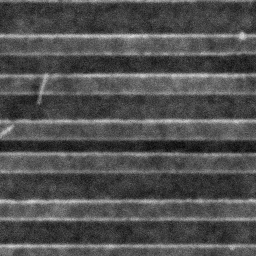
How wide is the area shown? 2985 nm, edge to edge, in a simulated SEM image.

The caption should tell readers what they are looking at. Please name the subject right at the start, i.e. lines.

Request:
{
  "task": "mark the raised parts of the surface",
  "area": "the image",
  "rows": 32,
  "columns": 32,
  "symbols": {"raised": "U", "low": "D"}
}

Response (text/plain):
DDDDDDDDDDDDDDDDDDDDDDDDDDDDDDDD
DDDDDDDDDDDDDDDDDDDDDDDDDDDDDDDD
DDDDDDDDDDDDDDDDDDDDDDDDDDDDDDDD
DDDDDDDDDDDDDDDDDDDDDDDDDDDDDDDD
UUUDUUUUUUUUUUUUUUUUUUUUUUUUUUUU
UUUUUUUUUUUUUUUUUUUUUUUUUUUUUUUU
UUUUUUUUUUUUUUUUUUUUUUUUUUUUUUUU
DDDDDDDDDDDDDDDDDDDDDDDDDDDDDDDD
DDDDDDDDDDDDDDDDDDDDDDDDDDDDDDDD
UUUUUUUUUUUUUUUUUUUUUUUUUUUUUUUU
UUUUUUUUUUUUUUUUUUUUUUUUUUUUUUUU
UUUUUUUUUUUUUUUUUUUUUUUUUUUUUUUU
DDDDDDDDDDDDDDDDDDDDDDDDDDDDDDDD
DDDDDDDDDDDDDDDDDDDDDDDDDDDDDDDD
DDDDDDDDDDDDDDDDDDDDDDDDDDDDDDDD
UUUUUUUUUUUUUUUUUUUUUUUUUUUUUUUU
UUUUUUUUUUUUUUUUUUUUUUUUUUUUUUUU
DDDDDDDDDDDDDDDDDDDDDDDDDDDDDDDD
DDDDDDDDDDDDDDDDDDDDDDDDDDDDDDDD
UUUUUUUUUUUUUUUUUUUUUUUUUUUUUUUU
UUUUUUUUUUUUUUUUUUUUUUUUUUUUUUUU
DDDDDDDDDDDDDDDDDDDDDDDDDDDDDDDD
DDDDDDDDDDDDDDDDDDDDDDDDDDDDDDDD
DDDDDDDDDDDDDDDDDDDDDDDDDDDDDDDD
DDDDDDDDDDDDDDDDDDDDDDDDDDDDDDDD
UUUUUUUUUUUUUUUUUUUUUUUUUUUUUUUU
UUUUUUUUUUUUUUUUUUUUUUUUUUUUUUUU
DDDDDDDDDDDDDDDDDDDDDDDDDDDDDDDD
DDDDDDDDDDDDDDDDDDDDDDDDDDDDDDDD
DDDDDDDDDDDDDDDDDDDDDDDDDDDDDDDD
DDDDDDDDDDDDDDDDDDDDDDDDDDDDDDDD
UUUUUUUUUUUUUUUUUUUUUUUUUUUUUUUU